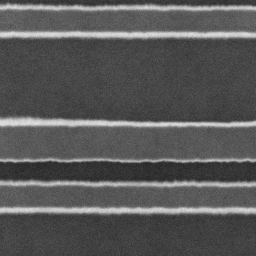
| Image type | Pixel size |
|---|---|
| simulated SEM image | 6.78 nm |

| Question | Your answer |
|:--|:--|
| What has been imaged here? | lines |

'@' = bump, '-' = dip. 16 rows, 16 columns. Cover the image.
@@@@@@@@@@@@@@@@
@@@@@@@@@@@@@@@@
----------------
----------------
----------------
----------------
----------------
----------------
@@@@@@@@@@@@@@@@
@@@@@@@@@@@@@@@@
@@@@@@@@@@@@@@@@
@@@@@@@@@@@@@@@@
@@@@@@@@@@@@@@@@
----------------
----------------
----------------